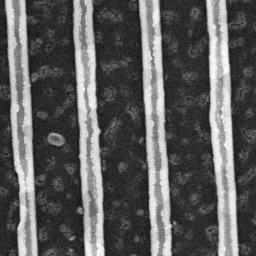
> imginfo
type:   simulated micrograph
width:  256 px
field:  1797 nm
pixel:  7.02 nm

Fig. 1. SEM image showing one or a few lines or trenches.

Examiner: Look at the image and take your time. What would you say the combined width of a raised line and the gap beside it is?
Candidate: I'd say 468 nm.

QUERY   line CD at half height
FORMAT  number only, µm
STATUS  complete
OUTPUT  0.0929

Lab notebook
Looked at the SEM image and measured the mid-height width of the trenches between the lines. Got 379 nanometers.